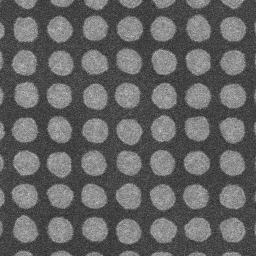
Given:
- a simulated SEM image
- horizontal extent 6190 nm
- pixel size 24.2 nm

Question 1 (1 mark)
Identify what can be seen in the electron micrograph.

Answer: a regular array of raised bodies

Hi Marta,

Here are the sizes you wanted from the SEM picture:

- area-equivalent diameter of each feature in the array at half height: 580 nanometers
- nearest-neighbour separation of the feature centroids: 797 nm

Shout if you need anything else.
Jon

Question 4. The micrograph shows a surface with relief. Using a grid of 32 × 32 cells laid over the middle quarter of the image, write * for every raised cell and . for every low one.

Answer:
**...******...*****....*****...*
**....****.....****....****.....
*...............................
................................
................................
*......**.....****......***.....
*.....****...******....*****...*
**...******..******...******...*
**...******..******...******...*
*....******..*****.....*****...*
......****.....***......***.....
................................
................................
........................**......
*.....****....****.....****....*
*....******..******...******...*
**...******..******...******..**
**...******...*****...******...*
*.....****....*****....****.....
........*......***..............
................................
................................
......***.....****.....***.....*
*....*****....*****...*****...**
**...*****...******...*****...**
**...*****....*****...*****...**
**...*****....*****...*****....*
*......**......***.....***......
................................
................................
......**.......***......**......
**...*****....*****...*****....*